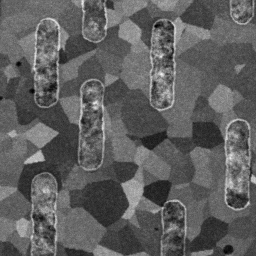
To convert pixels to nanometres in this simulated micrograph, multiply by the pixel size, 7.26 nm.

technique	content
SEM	holes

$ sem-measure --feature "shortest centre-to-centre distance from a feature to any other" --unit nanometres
619